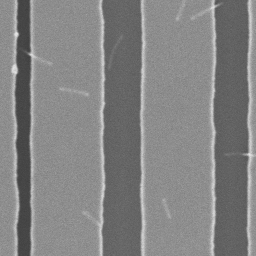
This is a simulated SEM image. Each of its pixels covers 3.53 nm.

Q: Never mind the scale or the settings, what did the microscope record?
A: lines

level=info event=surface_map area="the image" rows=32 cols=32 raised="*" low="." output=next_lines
**..*********.....*********....*
**..*********.....*********....*
**..*********.....*********....*
**..*********.....*********....*
**..*********.....*********....*
**..*********.....*********....*
**..*********.....*********....*
**..*********.....*********....*
**..*********.....*********....*
**..*********.....*********....*
**..*********.....*********....*
**..*********.....*********....*
**..*********.....*********....*
**..*********.....*********....*
**..*********.....*********....*
**..*********.....*********....*
**..*********.....*********....*
**..*********.....*********....*
**..*********.....*********....*
**..*********.....*********....*
**..*********.....*********....*
**..*********.....*********....*
**..*********.....*********....*
**..*********.....*********....*
**..*********.....*********....*
**..*********.....*********....*
**..*********.....*********....*
**..*********.....*********....*
**..*********.....*********....*
**..*********.....*********....*
**..*********.....*********....*
**..*********.....*********....*